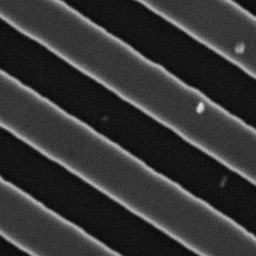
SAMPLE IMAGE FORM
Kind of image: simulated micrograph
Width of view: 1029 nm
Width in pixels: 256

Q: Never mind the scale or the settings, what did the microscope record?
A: lines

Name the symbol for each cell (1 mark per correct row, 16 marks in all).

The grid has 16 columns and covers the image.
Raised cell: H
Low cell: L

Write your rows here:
HHHHHLLLLHHHHHHL
LHHHHHLLLLLHHHHH
LLHHHHHHLLLLHHHH
LLLLHHHHHLLLLLHH
LLLLLHHHHHHLLLLH
HHLLLLLHHHHHLLLL
HHHLLLLLHHHHHHLL
HHHHHLLLLLHHHHHL
LHHHHHLLLLLHHHHH
LLHHHHHHLLLLLHHH
LLLLHHHHHLLLLLHH
HLLLLLHHHHHLLLLL
HHLLLLLHHHHHHLLL
HHHHLLLLLHHHHHLL
HHHHHLLLLLHHHHHH
LHHHHHHLLLLLHHHH